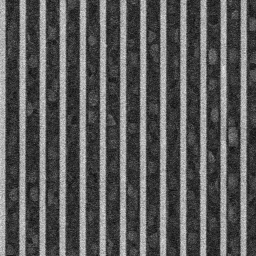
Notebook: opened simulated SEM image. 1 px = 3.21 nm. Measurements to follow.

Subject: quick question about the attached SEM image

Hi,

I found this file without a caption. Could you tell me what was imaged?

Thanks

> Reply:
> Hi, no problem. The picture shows parallel lines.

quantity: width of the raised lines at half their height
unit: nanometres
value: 19.3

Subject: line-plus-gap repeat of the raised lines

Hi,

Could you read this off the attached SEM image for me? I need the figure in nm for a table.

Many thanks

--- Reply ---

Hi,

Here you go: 64.7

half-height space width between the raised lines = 14.6 px